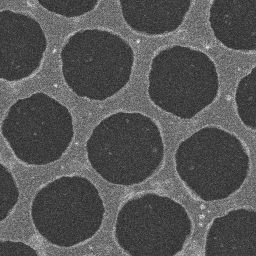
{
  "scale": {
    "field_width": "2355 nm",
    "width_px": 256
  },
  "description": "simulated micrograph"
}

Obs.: holes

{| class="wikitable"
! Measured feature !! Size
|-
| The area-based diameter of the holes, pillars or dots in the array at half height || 666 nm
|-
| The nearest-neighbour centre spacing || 0.805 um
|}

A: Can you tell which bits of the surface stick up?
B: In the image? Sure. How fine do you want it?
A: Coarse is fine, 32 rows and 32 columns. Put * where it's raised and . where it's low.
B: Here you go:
*****.......***.........***.....
..****.....****........***......
.....***********.......***......
.....***********......****......
......***......************.....
......**........************....
......**.........***.....*******
.....***.........**.......******
.....***........***........*****
....****........***........****.
********........***........***..
*********......****........**...
**.....*****.******........**...
*.......************......****..
*........*****....****..******..
.........***.......************.
.........***........*****...****
*........**.........***.......**
*.......***.........**........**
**......***.........**.........*
****..*****.........**.........*
.***********........**.........*
..*****....**.....*****........*
..***.......************......**
..**........*****...*****....***
..**.........***......**********
.***.........**........******...
****.........**.........***.....
****........**..........**......
*****.......**..........**......
...***...******........***......
.....***********......****......